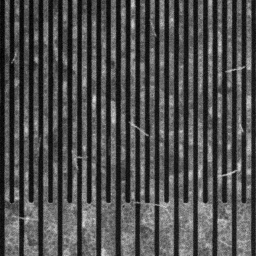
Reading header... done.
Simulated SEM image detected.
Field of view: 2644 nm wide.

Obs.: parallel lines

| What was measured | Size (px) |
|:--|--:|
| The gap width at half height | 5.25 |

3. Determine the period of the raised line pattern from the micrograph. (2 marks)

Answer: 100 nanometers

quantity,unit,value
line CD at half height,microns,0.0439